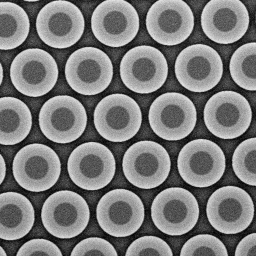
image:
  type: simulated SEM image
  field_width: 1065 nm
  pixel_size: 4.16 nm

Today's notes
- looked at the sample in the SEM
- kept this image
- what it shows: an array of small figures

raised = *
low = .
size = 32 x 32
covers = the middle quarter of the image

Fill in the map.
************..************..****
************..************..****
************..************..****
.***********..************..****
.***********...**********....***
..*********.....********......**
..********.......******........*
....****.................****...
**........*******......********.
****.....*********....**********
*****...***********...**********
*****...***********..***********
*****...***********..***********
******..***********..***********
******..***********..***********
*****...***********...**********
*****...***********...**********
****.....*********.....********.
***.......*******........*****..
**.................***..........
....******.......*******......**
...********.....*********....***
..**********...***********...***
.************..***********...***
.************..***********..****
.************..************..***
.************..***********...***
.************..***********...***
..**********....**********....**
..*********.....*********......*
....******........*****.........
.............***.........******.